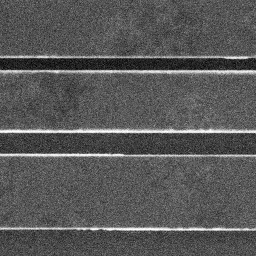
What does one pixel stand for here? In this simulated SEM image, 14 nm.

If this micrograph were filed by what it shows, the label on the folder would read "lines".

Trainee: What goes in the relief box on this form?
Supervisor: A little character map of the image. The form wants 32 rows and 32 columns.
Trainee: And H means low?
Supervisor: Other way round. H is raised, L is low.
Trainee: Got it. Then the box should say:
HHHHHHHHHHHHHHHHHHHHHHHHHHHHHHHH
HHHHHHHHHHHHHHHHHHHHHHHHHHHHHHHH
HHHHHHHHHHHHHHHHHHHHHHHHHHHHHHHH
HHHHHHHHHHHHHHHHHHHHHHHHHHHHHHHH
HHHHHHHHHHHHHHHHHHHHHHHHHHHHHHHH
HHHHHHHHHHHHHHHHHHHHHHHHHHHHHHHH
HHHHHHHHHHHHHHHHHHHHHHHHHHHHHHHH
LLLLLLLLLLLLLLLLLLLLLLLLLLLLLLLL
LLLLLLLLLLLLLLLLLLLLLLLLLLLLLLLL
HHHHHHHHHHHHHHHHHHHHHHHHHHHHHHHH
HHHHHHHHHHHHHHHHHHHHHHHHHHHHHHHH
HHHHHHHHHHHHHHHHHHHHHHHHHHHHHHHH
HHHHHHHHHHHHHHHHHHHHHHHHHHHHHHHH
HHHHHHHHHHHHHHHHHHHHHHHHHHHHHHHH
HHHHHHHHHHHHHHHHHHHHHHHHHHHHHHHH
HHHHHHHHHHHHHHHHHHHHHHHHHHHHHHHH
HHHHHHHHHHHLLHHHHHHHHHHHHHHHHHHH
LLLLLLLLLLLLLLLLLLLLLLLLLLLLLLLL
LLLLLLLLLLLLLLLLLLLLLLLLLLLLLLLL
HHHHHHHHHHHHHHHHHHHHHHHHHHHHHHHH
HHHHHHHHHHHHHHHHHHHHHHHHHHHHHHHH
HHHHHHHHHHHHHHHHHHHHHHHHHHHHHHHH
HHHHHHHHHHHHHHHHHHHHHHHHHHHHHHHH
HHHHHHHHHHHHHHHHHHHHHHHHHHHHHHHH
HHHHHHHHHHHHHHHHHHHHHHHHHHHHHHHH
HHHHHHHHHHHHHHHHHHHHHHHHHHHHHHHH
HHHHHHHHHHHHHHHHHHHHHHHHHHHHHHHH
HHHHHHHHHHHHHHHHHHHHHHHHHHHHHHHH
HHHHHHHHHHHHHHHHHHHHHHHHHHHHHHHH
LLLLLLLLLLLLLLLLLLLLLLLLLLLLLLLL
LLLLLLLLLLLLLLLLLLLLLLLLLLLLLLLL
LLLLLLLLLLLLLLLLLLLLLLLLLLLLLLLL